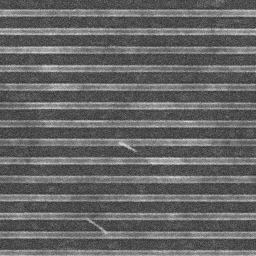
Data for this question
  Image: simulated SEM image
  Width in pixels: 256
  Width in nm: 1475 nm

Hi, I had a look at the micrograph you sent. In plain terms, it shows parallel lines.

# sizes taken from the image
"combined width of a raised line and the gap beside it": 106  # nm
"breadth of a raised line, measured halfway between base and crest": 34.6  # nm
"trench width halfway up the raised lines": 74.9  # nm